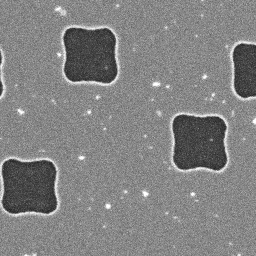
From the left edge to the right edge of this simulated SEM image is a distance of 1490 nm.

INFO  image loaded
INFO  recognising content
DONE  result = holes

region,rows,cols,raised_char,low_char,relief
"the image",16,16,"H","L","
HHHHHHHHHHHHHHHH
HHHHHHHHHHHHHHHH
HHHHLLLHHHHHHHHH
HHHHLLLHHHHHHHHL
HHHHLLLHHHHHHHHL
HHHHHHHHHHHHHHHL
HHHHHHHHHHHHHHHH
HHHHHHHHHHHLLLHH
HHHHHHHHHHHLLLHH
HHHHHHHHHHHLLLHH
LLLHHHHHHHHLLLHH
LLLHHHHHHHHHHHHH
LLLLHHHHHHHHHHHH
HHHHHHHHHHHHHHHH
HHHHHHHHHHHHHHHH
HHHHHHHHHHHHHHHH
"